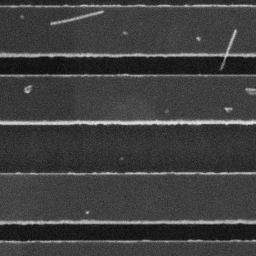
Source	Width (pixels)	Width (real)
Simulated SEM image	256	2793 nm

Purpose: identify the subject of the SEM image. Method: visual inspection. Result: lines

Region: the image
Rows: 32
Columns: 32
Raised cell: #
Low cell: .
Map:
................................
################################
################################
################################
################################
################################
################################
................................
................................
################################
################################
################################
################################
################################
################################
................................
................................
................................
................................
................................
................................
................................
################################
################################
################################
################################
################################
################################
................................
................................
################################
################################